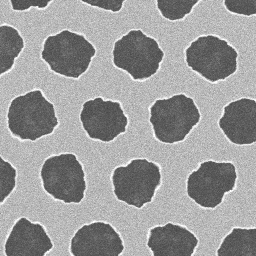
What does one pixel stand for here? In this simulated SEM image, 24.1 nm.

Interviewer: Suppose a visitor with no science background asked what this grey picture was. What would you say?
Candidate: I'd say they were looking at a regular array of holes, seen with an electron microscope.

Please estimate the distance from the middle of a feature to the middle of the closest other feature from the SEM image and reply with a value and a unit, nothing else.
1.71 um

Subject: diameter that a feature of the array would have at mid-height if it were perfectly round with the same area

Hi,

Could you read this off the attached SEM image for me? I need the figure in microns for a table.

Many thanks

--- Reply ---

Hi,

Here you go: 1.14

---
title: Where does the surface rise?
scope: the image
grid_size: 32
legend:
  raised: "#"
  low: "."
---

#.....#####....#####....####....
####################....#####...
################################
..##############################
...###....######..########.#####
...###.....###......####.....###
...##.......##......###.......##
..####.....###......###.......##
.#####.....####.....####......##
########..######...######....###
################################
####.###########################
##....#####..#######....######..
#......###.....####......###....
#......###......###......###....
#......###......###......##.....
#.....#####....####.....####....
#############.######...######...
################################
#######..#######################
.####.....######...######....###
..###.....####......####.....###
..###......###......###......###
..####.....###.....####......###
.######...####.....#####....####
################..#######..#####
################################
##.#############################
##...#####....#####....#########
#.....###......####.....####....
#.....###......###.......###....
#.....###......####.....###.....